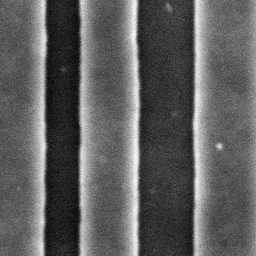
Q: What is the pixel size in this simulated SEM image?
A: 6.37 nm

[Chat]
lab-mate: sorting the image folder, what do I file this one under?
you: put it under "lines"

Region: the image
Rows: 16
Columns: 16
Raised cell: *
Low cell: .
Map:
***..***....****
***..***....****
***..***....****
***..****...****
***..****...****
***..****...****
***..****...****
***..****...****
***..****...****
***..****...****
***..****...****
***..****...****
***..****...****
***..****...****
***..***....****
***..****...****